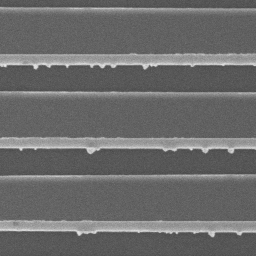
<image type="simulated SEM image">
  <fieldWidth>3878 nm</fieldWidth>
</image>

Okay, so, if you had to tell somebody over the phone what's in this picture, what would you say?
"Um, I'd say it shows lines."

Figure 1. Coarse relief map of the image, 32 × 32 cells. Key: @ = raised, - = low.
--------------------------------
@@@@@@@@@@@@@@@@@@@@@@@@@@@@@@@@
@@@@@@@@@@@@@@@@@@@@@@@@@@@@@@@@
@@@@@@@@@@@@@@@@@@@@@@@@@@@@@@@@
@@@@@@@@@@@@@@@@@@@@@@@@@@@@@@@@
@@@@@@@@@@@@@@@@@@@@@@@@@@@@@@@@
@@@@@@@@@@@@@@@@@@@@@@@@@@@@@@@@
@@@@@@@@@@@@@@@@@@@@@@@@@@@@@@@@
--------------------------------
--------------------------------
--------------------------------
--------------------------------
@@@@@@@@@@@@@@@@@@@@@@@@@@@@@@@@
@@@@@@@@@@@@@@@@@@@@@@@@@@@@@@@@
@@@@@@@@@@@@@@@@@@@@@@@@@@@@@@@@
@@@@@@@@@@@@@@@@@@@@@@@@@@@@@@@@
@@@@@@@@@@@@@@@@@@@@@@@@@@@@@@@@
@@@@@@@@@@@@@@@@@@@@@@@@@@@@@@@@
--@-@-----@@@-------@@@@@@@@@@@@
--------------------------------
--------------------------------
--------------------------------
@@@@@@@@@@@@@@@@@@@@@@@@@@@@@@@@
@@@@@@@@@@@@@@@@@@@@@@@@@@@@@@@@
@@@@@@@@@@@@@@@@@@@@@@@@@@@@@@@@
@@@@@@@@@@@@@@@@@@@@@@@@@@@@@@@@
@@@@@@@@@@@@@@@@@@@@@@@@@@@@@@@@
@@@@@@@@@@@@@@@@@@@@@@@@@@@@@@@@
@@@@@@@@@@@@@@@@@@@@@@@@@@@@@@@@
--------------------------------
--------------------------------
--------------------------------